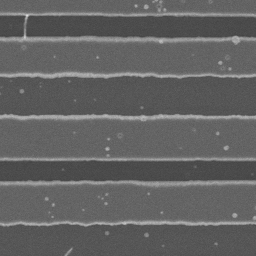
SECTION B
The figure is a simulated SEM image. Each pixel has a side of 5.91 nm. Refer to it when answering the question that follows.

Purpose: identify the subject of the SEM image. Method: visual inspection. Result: lines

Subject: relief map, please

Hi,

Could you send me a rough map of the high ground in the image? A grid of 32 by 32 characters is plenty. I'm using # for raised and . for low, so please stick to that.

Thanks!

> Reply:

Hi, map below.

################################
################################
................................
................................
................................
################################
################################
################################
################################
##...##....###.....#######.#####
................................
................................
................................
................................
##....#...####.....######....#..
################################
################################
################################
################################
################################
................................
................................
................................
################################
################################
################################
################################
################################
................................
................................
................................
................................